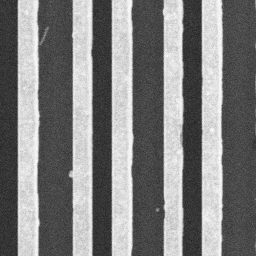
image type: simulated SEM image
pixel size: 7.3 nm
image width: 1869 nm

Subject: lines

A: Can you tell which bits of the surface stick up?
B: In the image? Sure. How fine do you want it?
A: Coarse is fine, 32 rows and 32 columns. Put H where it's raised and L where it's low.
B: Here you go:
LLHHHLLLLHHLLLHHLLLLLHHLLHHHLLLL
LLHHHLLLLHHLLLHHLLLLHHHLLHHHLLLL
LLHHHLLLLHHLLLHHLLLLLHHLLHHHLLLL
LLHHHLLLLHHLLLHHLLLLLHHLLHHHLLLL
LLHHHLLLLHHLLLHHLLLLLHHLLHHHLLLL
LLHHHLLLLHHLLLHHLLLLLHHLLHHHLLLL
LLHHHLLLLHHLLLHHLLLLLHHLLHHHLLLL
LLHHHLLLLHHLLLHHLLLLLHHLLHHHLLLL
LLHHHLLLLHHLLLHHLLLLLHHLLHHHLLLL
LLHHHLLLLHHLLLHHLLLLLHHLLHHHLLLL
LLHHHLLLLHHLLLHHLLLLLHHLLHHHLLLL
LLHHHLLLLHHLLLHHLLLLLHHLLHHHLLLL
LLHHHLLLLHHLLLHHLLLLLHHLLHHHLLLL
LLHHHLLLLHHLLLHHLLLLLHHLLHHHLLLL
LLHHHLLLLHHLLLHHLLLLLHHLLHHHLLLL
LLHHHLLLLHHLLLHHLLLLLHHLLHHHLLLL
LLHHHLLLLHHLLLHHLLLLLHHLLHHHLLLL
LLHHHLLLLHHLLLHHLLLLLHHLLHHHLLLL
LLHHHLLLLHHLLLHHLLLLLHHLLHHHLLLL
LLHHHLLLLHHLLLHHLLLLLHHLLHHHLLLL
LLHHHLLLLHHLLLHHLLLLLHHLLHHHLLLL
LLHHHLLLLHHLLLHHLLLLLHHLLHHHLLLL
LLHHHLLLLHHLLLHHLLLLLHHLLHHHLLLL
LLHHHLLLLHHLLLHHLLLLLHHLLHHHLLLL
LLHHHLLLLHHLLLHHLLLLLHHLLHHHLLLL
LLHHHLLLLHHLLLHHLLLLLHHLLHHHLLLL
LLHHHLLLLHHLLLHHLLLLLHHLLHHHLLLL
LLHHHLLLLHHLLLHHLLLLLHHLLHHHLLLL
LLHHHLLLLHHLLLHHLLLLLHHLLHHHLLLL
LLHHHLLLLHHLLLHHLLLLLHHLLHHHLLLL
LLHHHLLLLHHLLLHHLLLLLHHLLHHHLLLL
LLHHHLLLLHHLLLHHLLLLLHHLLHHHLLLL